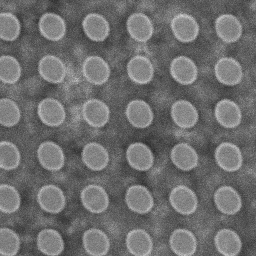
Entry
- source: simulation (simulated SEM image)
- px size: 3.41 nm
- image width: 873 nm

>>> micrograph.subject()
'a regular array of raised bodies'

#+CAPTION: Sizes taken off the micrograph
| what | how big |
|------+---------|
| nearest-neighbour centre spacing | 146 nanometers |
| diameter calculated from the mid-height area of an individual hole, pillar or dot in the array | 89.7 nm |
